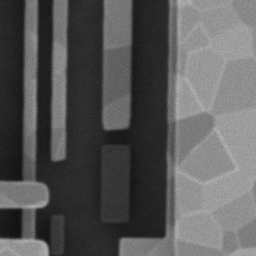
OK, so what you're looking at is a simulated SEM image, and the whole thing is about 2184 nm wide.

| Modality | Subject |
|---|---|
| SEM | wiring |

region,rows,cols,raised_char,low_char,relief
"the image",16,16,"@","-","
-----------@@@@@
-----------@@@@@
-----------@@@@@
-----------@@@@@
-----------@@@@@
-----------@@@@@
-----------@@@@@
-----------@@@@@
-----------@@@@@
-----------@@@@@
-----------@@@@@
@@@--------@@@@@
@@@--------@@@@@
-----------@@@@@
-----------@@@@@
@@@--------@@@@@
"